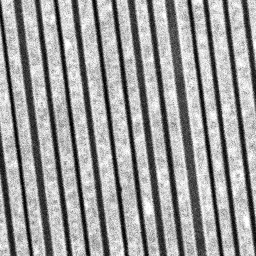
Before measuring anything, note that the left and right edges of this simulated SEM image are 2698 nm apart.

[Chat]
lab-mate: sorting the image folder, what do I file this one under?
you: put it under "parallel lines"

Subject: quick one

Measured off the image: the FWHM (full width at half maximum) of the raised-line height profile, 0.124 micrometres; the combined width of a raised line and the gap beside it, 18.7 px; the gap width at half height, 0.0706 um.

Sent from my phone